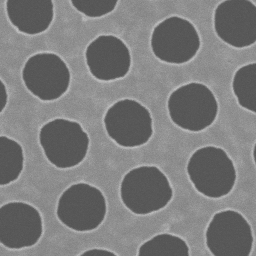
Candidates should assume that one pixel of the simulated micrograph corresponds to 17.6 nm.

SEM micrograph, a regular array of holes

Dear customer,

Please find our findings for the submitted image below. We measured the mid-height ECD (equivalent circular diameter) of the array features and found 0.85 micrometres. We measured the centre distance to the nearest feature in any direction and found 1160 nm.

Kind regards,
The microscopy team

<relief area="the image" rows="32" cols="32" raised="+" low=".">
+......++......+++++++++++++....
+......+++....+++++++++++++.....
+.....+++++++++++++++..++++.....
++....+++++++++++++.....+++.....
+++++++++++++.+++++......++.....
+++++++++++.....+++......++++..+
+++++++++++.....+++......+++++++
++++....+++.....++++....++++++++
+++.....+++.....++++++++++++++..
+++......+++...++++++++++++++...
+++......+++++++++++++++.++++...
.+++....++++++++++++++....+++...
.++++.+++++++++.+++++......+++..
++++++++++++++....+++......++++.
+++++++++++++......++......+++++
++++++....+++......+++....++++++
+++++......++......+++++++++++++
..+++......+++....++++++++++++++
...++......++++++++++++++..+++++
...+++.....+++++++++++++....++++
...++++...+++++++++++++......+++
...+++++++++++++....+++......+++
..+++++++++++++......+++.....+++
+++++++++...+++......++++....+++
++++++++.....++......+++++..++++
+..++++......+++.....+++++++++++
.....++......++++..+++++++++..++
.....+++.....+++++++++++++.....+
.....++++...++++++++++++++.....+
.....++++++++++++++...++++......
....++++++++++++++.....+++......
+++++++++++...+++.......++.....+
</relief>